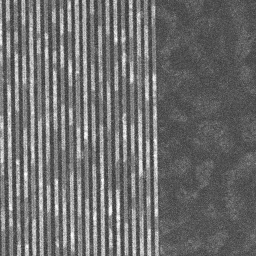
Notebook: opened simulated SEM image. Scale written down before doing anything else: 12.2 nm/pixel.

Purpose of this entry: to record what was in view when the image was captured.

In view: parallel lines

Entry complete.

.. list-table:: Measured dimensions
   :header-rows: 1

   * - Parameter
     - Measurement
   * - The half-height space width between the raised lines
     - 56.6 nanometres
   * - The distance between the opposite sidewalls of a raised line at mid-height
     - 38.2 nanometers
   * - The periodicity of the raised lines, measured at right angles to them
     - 0.0937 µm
